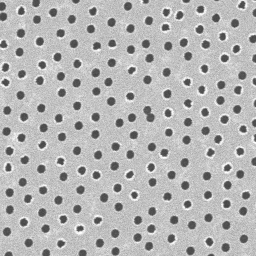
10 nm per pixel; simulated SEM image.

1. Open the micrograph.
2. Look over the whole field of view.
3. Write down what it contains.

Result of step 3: a regular array of holes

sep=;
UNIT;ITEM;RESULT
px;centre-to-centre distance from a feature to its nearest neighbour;17.2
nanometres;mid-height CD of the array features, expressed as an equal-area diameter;86.2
